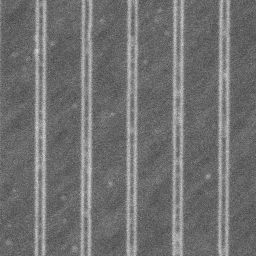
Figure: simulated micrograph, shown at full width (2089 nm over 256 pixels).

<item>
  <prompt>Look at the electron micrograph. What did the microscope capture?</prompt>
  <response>parallel lines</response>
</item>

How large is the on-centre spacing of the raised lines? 0.374 microns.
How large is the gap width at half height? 312 nm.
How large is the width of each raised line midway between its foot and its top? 0.0602 um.